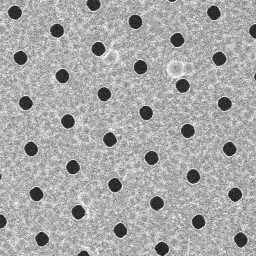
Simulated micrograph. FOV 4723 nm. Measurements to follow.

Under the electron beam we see a regular array of holes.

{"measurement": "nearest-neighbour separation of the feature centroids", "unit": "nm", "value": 837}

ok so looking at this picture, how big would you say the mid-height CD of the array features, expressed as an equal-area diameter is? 262 nm